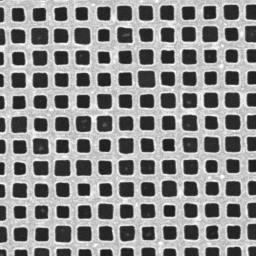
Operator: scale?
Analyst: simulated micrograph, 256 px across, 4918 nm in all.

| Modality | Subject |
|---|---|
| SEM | a regular array of holes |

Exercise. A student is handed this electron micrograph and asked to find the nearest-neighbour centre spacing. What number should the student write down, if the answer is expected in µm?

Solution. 0.407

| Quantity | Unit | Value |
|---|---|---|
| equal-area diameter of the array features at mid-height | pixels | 16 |